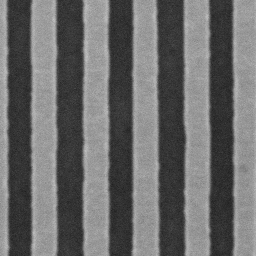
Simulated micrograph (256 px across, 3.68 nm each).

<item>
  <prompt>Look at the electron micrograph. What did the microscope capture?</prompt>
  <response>lines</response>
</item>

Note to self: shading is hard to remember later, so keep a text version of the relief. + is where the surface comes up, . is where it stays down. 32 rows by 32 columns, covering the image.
+...+++...++++...++....+++...+++
+...+++...++++...+++...+++...+++
+...+++...+++....+++...+++...+++
+...+++....++....+++...+++...+++
+...+++....++....+++...+++...+++
+...+++....++....+++...+++...+++
+...+++...++++...+++...+++...+++
+...+++....+++...+++...+++...+++
+...+++....+++...+++...+++...+++
+...+++...++++...+++...+++...+++
+...+++...+++....+++...+++...+++
+...+++...+++....+++...+++...+++
+...+++...+++....+++...+++...+++
+...+++...+++....+++...+++...+++
+...+++...++++...+++...+++...+++
+...+++...++++...+++...+++...+++
+...+++...++++...+++...+++...+++
+...+++...++++...+++...+++...+++
+...+++...++++...+++...+++...+++
+...+++...+++....+++...+++...+++
+...+++...++++...+++...+++...+++
+...+++....+++...+++...+++...+++
+...+++....++....+++...+++...+++
+...+++...+++....+++...+++...+++
+...+++...++++...+++...+++...+++
+...+++...++++...+++...+++...+++
+...+++...++++...+++...+++...+++
+...+++...++++...+++...+++...+++
+...+++...++++...+++...+++...+++
+...+++....+++...+++...+++...+++
+...+++...++++...+++...+++...+++
+...+++...++++...+++...+++...+++